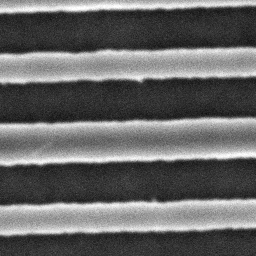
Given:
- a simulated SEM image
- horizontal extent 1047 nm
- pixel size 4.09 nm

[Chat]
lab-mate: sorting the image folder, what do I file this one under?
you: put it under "lines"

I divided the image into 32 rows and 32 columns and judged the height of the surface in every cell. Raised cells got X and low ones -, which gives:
XXXXXXXXXXXXXXXXXXXXXXXXXXXXXXXX
-X------------------------------
--------------------------------
--------------------------------
--------------------------------
--------------------------------
------------XXXXXXXXXXXXXXXXXXXX
XXXXXXXXXXXXXXXXXXXXXXXXXXXXXXXX
XXXXXXXXXXXXXXXXXXXXXXXXXXXXXXXX
XXXXXXXXXXXXXXXXXXXXXXXXXXXXXXX-
--------------------------------
--------------------------------
--------------------------------
--------------------------------
--------------------------------
----XXXXXXXXXXXXXXXXXXXXXXXXXXXX
XXXXXXXXXXXXXXXXXXXXXXXXXXXXXXXX
XXXXXXXXXXXXXXXXXXXXXXXXXXXXXXXX
XXXXXXXXXXXXXXXXXXXXXXXXXXXXXXXX
XXXXXXXXXXXXXXXXXXXXXXXXXXXXXXXX
XX------------------------------
--------------------------------
--------------------------------
--------------------------------
--------------------------------
-------X---XXXXXXXXXXXXXXXXXXXXX
XXXXXXXXXXXXXXXXXXXXXXXXXXXXXXXX
XXXXXXXXXXXXXXXXXXXXXXXXXXXXXXXX
XXXXXXXXXXXXXXXXXXXXXXXXXXXXXXX-
--------------------------------
--------------------------------
--------------------------------